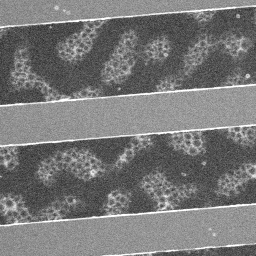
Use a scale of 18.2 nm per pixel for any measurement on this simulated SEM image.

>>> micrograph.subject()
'one or a few lines or trenches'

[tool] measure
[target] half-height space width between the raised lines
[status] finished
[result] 723 nm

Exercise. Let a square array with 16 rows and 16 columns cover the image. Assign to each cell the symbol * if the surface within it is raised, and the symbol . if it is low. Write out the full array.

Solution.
..............**
..**************
****************
****************
****************
**************..
**..............
................
.........*******
****************
****************
****************
****************
*******.........
................
.............***